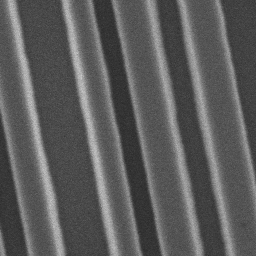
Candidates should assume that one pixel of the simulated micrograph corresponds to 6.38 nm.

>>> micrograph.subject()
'lines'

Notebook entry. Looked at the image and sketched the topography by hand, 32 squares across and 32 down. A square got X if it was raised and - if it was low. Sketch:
X-------XXXX--XXXXX----XXXX-----
XX------XXXX--XXXXX----XXXXX----
XX-------XXX---XXXX----XXXXX----
XX-------XXX---XXXX----XXXXX----
XX-------XXX---XXXXX---XXXXX----
XX-------XXXX--XXXXX----XXXX----
XXX------XXXX--XXXXX----XXXXX---
XXX-------XXX---XXXX----XXXXX---
XXX-------XXX---XXXX----XXXXX---
XXX-------XXX---XXXXX---XXXXX---
XXX-------XXX---XXXXX----XXXX---
XXXX------XXXX--XXXXX----XXXXX--
XXXX-------XXX---XXXX----XXXXX--
XXXX-------XXX---XXXX----XXXXX--
XXXX-------XXX---XXXXX---XXXXX--
XXXX-------XXX---XXXXX----XXXX--
-XXXX------XXXX--XXXXX----XXXXX-
-XXXX------XXXX---XXXX----XXXXX-
-XXXX-------XXX---XXXX----XXXXX-
-XXXX-------XXX---XXXXX---XXXXX-
-XXXX-------XXX---XXXXX----XXXX-
--XXXX------XXXX--XXXXX----XXXXX
--XXXX-------XXX---XXXX----XXXXX
--XXXX-------XXX---XXXX----XXXXX
--XXXX-------XXX---XXXXX---XXXXX
--XXXX-------XXX---XXXXX----XXXX
---XXXX------XXXX--XXXXX----XXXX
---XXXX------XXXX--XXXXX----XXXX
---XXXX-------XXX---XXXX----XXXX
---XXXX-------XXX---XXXXX---XXXX
---XXXX-------XXX---XXXXX---XXXX
X---XXXX------XXXX--XXXXX----XXX